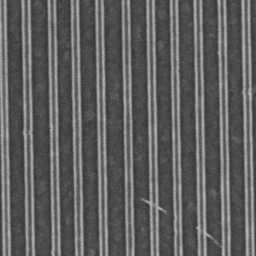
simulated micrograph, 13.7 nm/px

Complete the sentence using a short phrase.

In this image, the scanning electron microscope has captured parallel lines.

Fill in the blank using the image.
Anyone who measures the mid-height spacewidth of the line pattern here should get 254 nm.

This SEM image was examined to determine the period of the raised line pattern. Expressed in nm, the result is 334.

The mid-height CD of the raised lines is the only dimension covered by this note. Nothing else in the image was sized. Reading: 77.1 nm